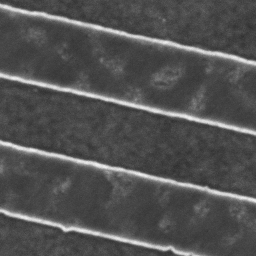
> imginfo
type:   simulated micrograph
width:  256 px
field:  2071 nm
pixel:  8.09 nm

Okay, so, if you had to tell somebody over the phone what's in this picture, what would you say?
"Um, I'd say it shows one or a few lines or trenches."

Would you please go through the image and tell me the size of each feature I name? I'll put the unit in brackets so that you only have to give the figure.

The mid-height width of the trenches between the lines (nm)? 530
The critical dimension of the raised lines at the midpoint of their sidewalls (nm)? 552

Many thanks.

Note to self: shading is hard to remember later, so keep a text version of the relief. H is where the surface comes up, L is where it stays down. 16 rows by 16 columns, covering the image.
HLLLLLLLLLLLLLLL
HHHHHLLLLLLLLLLL
HHHHHHHHHHLLLLLL
HHHHHHHHHHHHHHLL
HHHHHHHHHHHHHHHH
LLLHHHHHHHHHHHHH
LLLLLLLLHHHHHHHH
LLLLLLLLLLLLHHHH
LLLLLLLLLLLLLLLL
HHHLLLLLLLLLLLLL
HHHHHHHLLLLLLLLL
HHHHHHHHHHHLLLLL
HHHHHHHHHHHHHHHH
LHHHHHHHHHHHHHHH
LLLLLHHHHHHHHHHH
LLLLLLLLLLHHHHHH